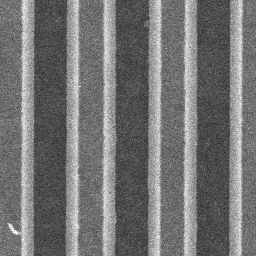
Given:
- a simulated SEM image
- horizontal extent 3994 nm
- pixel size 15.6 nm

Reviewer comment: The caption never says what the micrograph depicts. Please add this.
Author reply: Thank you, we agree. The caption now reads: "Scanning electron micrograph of one or a few lines or trenches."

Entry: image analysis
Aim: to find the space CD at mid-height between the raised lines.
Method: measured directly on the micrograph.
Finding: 692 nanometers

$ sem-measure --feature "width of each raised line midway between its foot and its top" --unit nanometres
583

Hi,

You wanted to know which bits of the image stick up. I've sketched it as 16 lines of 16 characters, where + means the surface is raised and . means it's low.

++...++...++...+
++...++...++...+
++...++...++...+
++...++...++...+
++..+++...++...+
++..+++...++...+
++...++...++...+
++...++...++...+
++...++...++...+
++...++...++...+
++...++...++...+
++...++...++...+
++...++...++...+
++..+++...++...+
++..+++...++...+
++..+++...++...+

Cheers